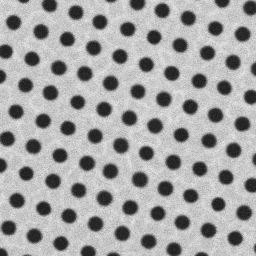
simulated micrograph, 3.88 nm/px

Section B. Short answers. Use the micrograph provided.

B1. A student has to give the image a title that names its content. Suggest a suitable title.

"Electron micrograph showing a regular array of holes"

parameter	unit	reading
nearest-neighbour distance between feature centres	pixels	26.9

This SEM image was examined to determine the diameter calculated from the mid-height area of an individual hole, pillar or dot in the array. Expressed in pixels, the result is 14.4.